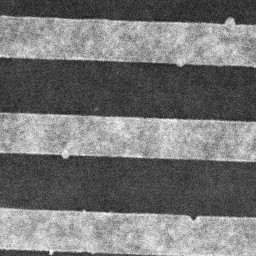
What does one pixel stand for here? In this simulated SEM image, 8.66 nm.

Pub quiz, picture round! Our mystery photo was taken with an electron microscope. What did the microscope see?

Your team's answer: one or a few lines or trenches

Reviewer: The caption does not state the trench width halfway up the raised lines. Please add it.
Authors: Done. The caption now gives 491 nanometres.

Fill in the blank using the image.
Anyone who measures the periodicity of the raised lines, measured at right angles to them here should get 832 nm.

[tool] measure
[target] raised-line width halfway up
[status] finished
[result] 345 nm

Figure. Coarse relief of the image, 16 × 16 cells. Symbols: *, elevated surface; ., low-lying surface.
................
*************.*.
****************
****************
................
................
................
***********.....
****************
****************
................
................
................
************....
****************
****************